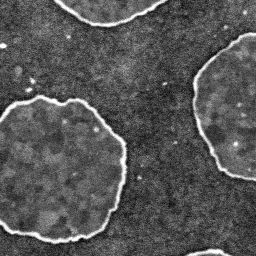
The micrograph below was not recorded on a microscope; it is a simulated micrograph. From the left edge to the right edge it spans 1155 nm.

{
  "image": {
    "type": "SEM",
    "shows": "raised bodies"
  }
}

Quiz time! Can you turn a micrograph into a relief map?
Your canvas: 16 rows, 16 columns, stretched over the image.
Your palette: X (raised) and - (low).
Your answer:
----XXXXXX------
------X---------
---------------X
-------------XXX
-------------XXX
------------XXXX
-XXXX-------XXXX
XXXXXX------XXXX
XXXXXXX------XXX
XXXXXXXX-----XXX
XXXXXXXX------XX
XXXXXXXX--------
XXXXXXX---------
XXXXXXX---------
-XXXXX----------
----------------